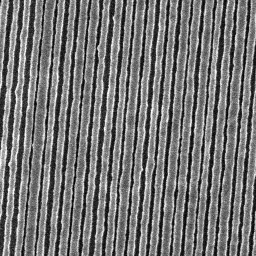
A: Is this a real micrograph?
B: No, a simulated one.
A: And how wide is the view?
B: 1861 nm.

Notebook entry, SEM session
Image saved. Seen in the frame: parallel lines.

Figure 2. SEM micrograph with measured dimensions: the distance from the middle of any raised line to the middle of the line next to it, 11.3 px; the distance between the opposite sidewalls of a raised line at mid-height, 0.0498 microns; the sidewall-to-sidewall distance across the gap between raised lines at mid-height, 30.8 nm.